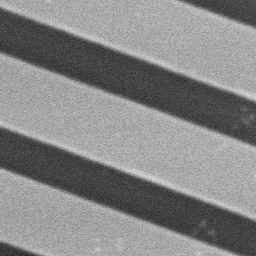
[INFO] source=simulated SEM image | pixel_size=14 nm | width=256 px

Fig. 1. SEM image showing lines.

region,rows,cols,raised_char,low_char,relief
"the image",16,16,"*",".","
************....
...************.
......**********
........********
***........*****
******........**
*********.......
***********.....
..************..
.....***********
.......*********
***.......******
*****........***
********.......*
***********.....
.*************..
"